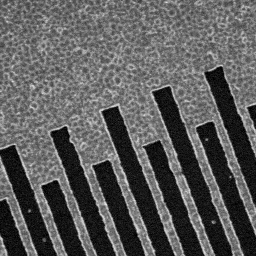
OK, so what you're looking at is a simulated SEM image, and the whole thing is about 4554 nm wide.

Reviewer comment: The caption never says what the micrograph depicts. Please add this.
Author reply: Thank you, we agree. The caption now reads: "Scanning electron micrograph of parallel lines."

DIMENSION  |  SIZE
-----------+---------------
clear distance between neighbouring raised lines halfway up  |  336 nm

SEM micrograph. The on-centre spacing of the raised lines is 488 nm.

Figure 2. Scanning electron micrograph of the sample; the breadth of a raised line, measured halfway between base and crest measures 152 nanometres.